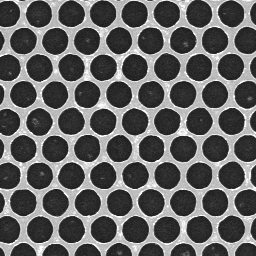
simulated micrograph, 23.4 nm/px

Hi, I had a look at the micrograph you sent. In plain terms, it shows a regular array of holes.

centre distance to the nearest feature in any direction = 31.1 pixels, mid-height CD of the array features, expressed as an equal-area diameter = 0.632 µm